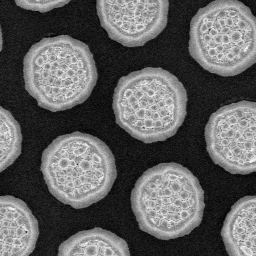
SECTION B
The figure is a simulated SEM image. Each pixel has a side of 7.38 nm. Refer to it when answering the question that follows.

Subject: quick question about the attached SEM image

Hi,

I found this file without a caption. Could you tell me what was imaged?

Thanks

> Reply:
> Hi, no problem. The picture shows raised bodies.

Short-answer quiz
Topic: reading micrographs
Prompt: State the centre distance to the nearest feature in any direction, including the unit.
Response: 95.5 px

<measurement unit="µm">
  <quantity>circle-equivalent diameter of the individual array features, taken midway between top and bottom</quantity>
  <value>0.5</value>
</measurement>